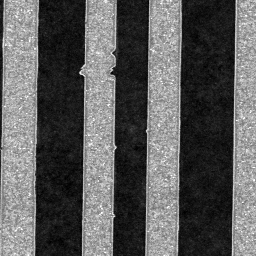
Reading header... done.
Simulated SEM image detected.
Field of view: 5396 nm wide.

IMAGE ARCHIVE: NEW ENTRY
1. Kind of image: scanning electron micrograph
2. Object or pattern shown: one or a few lines or trenches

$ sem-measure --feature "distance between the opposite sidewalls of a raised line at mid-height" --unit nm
680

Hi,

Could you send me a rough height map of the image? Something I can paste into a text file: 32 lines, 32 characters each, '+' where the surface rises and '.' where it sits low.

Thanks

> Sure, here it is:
.++++......+++.....++++.......++
.++++......+++.....++++.......++
.++++......+++.....++++.......++
.++++......+++.....++++.......++
+++++......+++.....++++.......++
+++++......+++.....++++.......++
+++++......+++.....++++.......++
+++++......+++.....++++......+++
+++++.....++++.....+++.......+++
+++++.....++++.....+++.......+++
+++++......+++.....+++.......+++
+++++......+++.....+++.......+++
+++++......+++.....+++.......+++
+++++......+++.....+++.......+++
+++++......+++.....+++.......+++
++++.......+++....++++.......+++
++++.......+++....++++.......+++
++++......++++....++++.......+++
++++......++++....++++.......+++
++++......++++....++++.......+++
++++......++++....++++.......+++
++++.......+++....++++.......+++
++++.......+++....++++.......+++
++++.......+++....++++.......+++
++++.......+++....++++.......+++
++++......++++....++++.......+++
++++......++++....++++.......+++
++++......++++....++++.......+++
++++......++++....++++.......+++
++++......++++....++++.......+++
++++......++++....++++.......+++
++++......++++....++++.......+++